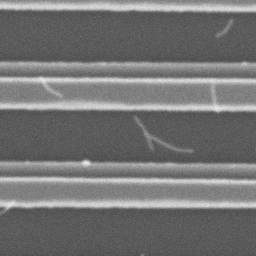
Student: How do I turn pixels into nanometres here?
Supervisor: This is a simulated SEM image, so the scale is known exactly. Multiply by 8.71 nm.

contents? lines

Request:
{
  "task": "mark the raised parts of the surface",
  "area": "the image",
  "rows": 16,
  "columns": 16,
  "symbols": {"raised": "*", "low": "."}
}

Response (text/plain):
****************
................
................
................
****************
****************
****************
................
................
................
****************
****************
****************
................
................
................